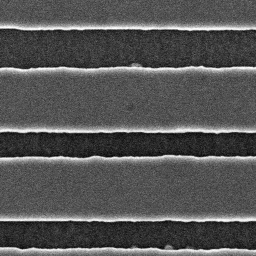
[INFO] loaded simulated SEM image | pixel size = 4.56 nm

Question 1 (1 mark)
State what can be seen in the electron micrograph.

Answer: lines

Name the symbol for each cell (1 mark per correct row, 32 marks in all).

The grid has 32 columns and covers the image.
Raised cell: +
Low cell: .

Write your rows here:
++++++++++++++++++++++++++++++++
++++++++++++++++++++++++++++++++
++++++++++++++++++++++++++++++++
..++++++++++++++++++++++++++++++
................................
................................
................................
................................
.......++.....++++.....+++...+++
++++++++++++++++++++++++++++++++
++++++++++++++++++++++++++++++++
++++++++++++++++++++++++++++++++
++++++++++++++++++++++++++++++++
++++++++++++++++++++++++++++++++
++++++++++++++++++++++++++++++++
++++++++++++++++++++++++++++++++
..++....++++++....+++++..+++..++
................................
................................
....................+++.........
++++++++++++++++++++++++++++++++
++++++++++++++++++++++++++++++++
++++++++++++++++++++++++++++++++
++++++++++++++++++++++++++++++++
++++++++++++++++++++++++++++++++
++++++++++++++++++++++++++++++++
++++++++++++++++++++++++++++++++
++++++++++++++++++++++++++++++++
................................
................................
................................
++++++++++++++++++++++++++++++++